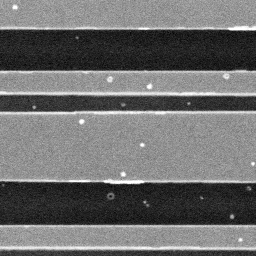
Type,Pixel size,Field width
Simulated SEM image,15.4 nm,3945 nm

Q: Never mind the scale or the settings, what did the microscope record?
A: lines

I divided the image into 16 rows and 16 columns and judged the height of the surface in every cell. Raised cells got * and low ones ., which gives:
****************
****************
................
................
****************
****************
****************
****************
****************
****************
****************
................
................
................
****************
****************